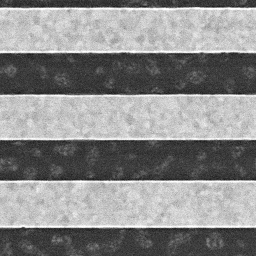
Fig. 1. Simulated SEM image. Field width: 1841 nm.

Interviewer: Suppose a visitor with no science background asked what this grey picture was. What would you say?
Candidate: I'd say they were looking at one or a few lines or trenches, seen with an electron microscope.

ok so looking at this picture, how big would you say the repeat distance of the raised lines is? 625 nm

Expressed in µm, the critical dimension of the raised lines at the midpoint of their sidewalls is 0.319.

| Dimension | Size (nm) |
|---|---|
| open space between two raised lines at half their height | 306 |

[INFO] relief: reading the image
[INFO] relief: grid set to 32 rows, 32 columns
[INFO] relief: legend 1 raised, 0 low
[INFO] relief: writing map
00000000000000000000000000000000
11111111111111111111111111111111
11111111111111111111111111111111
11111111111111111111111111111111
11111111111111111111111111111111
11111111111111111111111111111111
00000000000000000000000000000000
00000000000000000000000000000000
00000000000000000000000000000000
00000000000000000000000000000000
00000000000000000000000000000000
00000000000000000000000000000000
11111111111111111111111111111111
11111111111111111111111111111111
11111111111111111111111111111111
11111111111111111111111111111111
11111111111111111111111111111111
00000000000000000000000000000000
00000000000000000000000000000000
00000000000000000000000000000000
00000000000000000000000000000000
00000000000000000000000000000000
00000000000000000000000000000000
11111111111111111111111111111111
11111111111111111111111111111111
11111111111111111111111111111111
11111111111111111111111111111111
11111111111111111111111111111111
00000000000000000000000000000000
00000000000000000000000000000000
00000000000000000000000000000000
00000000000000000000000000000000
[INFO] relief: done